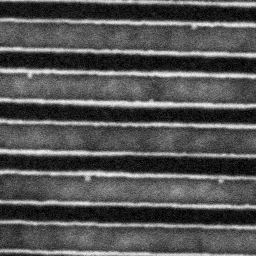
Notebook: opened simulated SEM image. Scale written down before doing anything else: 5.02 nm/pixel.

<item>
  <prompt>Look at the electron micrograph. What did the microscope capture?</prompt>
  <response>lines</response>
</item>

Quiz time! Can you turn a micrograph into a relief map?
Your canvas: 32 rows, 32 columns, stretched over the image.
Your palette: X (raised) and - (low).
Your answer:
XXXXXXXXXXXXXXXXXXXXXXXXXXXXXX--
XXXXXXXXXXXXXXXXXXXXXXXXXXXXXXXX
XXXXXXXXXXXXXXXXXXXXXXXXXXXXXXXX
--------------------------------
--------------------------------
--------------------------------
XXXXXXXXXXXXXXXXXX--------------
XXXXXXXXXXXXXXXXXXXXXXXXXXXXXXXX
XXXXXXXXXXXXXXXXXXXXXXXXXXXXXXXX
-----------------------------XXX
--------------------------------
--------------------------------
XXXXX---------------------------
XXXXXXXXXXXXXXXXXXXXXXXXXXXXXXXX
XXXXXXXXXXXXXXXXXXXXXXXXXXXXXXXX
-------------XXXXXXXXXXXXXXXXXXX
--------------------------------
--------------------------------
--------------------------------
XXXXXXXXXXXXXXXXXXXXXXXXXXXXXXXX
XXXXXXXXXXXXXXXXXXXXXXXXXXXXXXXX
XXXXXXXXXXXXXXXXXXXXXXXXXXXXXXXX
--------------------------------
--------------------------------
--------------------------------
XXXXXXXXXXXXXXXX-X--------------
XXXXXXXXXXXXXXXXXXXXXXXXXXXXXXXX
XXXXXXXXXXXXXXXXXXXXXXXXXXXXXXXX
-------------------------------X
--------------------------------
--------------------------------
XXXXXX--------------------------